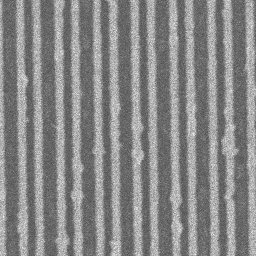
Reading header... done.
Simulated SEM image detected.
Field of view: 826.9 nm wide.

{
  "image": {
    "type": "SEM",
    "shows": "parallel lines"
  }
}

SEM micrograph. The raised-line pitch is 0.0613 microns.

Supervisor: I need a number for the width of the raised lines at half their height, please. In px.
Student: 7.37